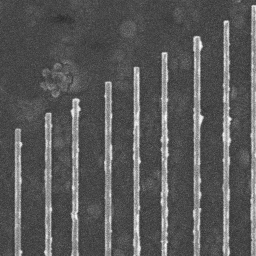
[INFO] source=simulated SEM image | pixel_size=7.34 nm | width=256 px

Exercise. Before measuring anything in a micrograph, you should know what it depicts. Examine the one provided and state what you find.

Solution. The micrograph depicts parallel lines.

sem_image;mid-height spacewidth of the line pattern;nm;166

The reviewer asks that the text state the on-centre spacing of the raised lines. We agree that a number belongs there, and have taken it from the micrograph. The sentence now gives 219 nanometres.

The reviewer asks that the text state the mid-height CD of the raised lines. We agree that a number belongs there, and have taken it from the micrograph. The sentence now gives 44.9 nm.